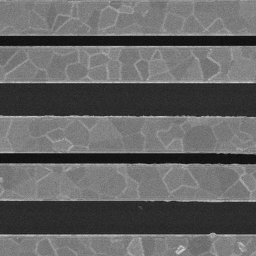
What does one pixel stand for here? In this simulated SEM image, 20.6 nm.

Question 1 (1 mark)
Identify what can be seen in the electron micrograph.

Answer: lines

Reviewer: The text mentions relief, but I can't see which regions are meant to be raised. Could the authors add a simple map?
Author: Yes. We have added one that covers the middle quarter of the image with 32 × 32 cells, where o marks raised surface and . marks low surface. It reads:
oooooooooooooooooooooooooooooooo
oooooooooooooooooooooooooooooooo
oooooooooooooooooooooooooooooooo
oooooooooooooooooooooooooooooooo
oooooooooooooooooooooooooooooooo
................................
................................
................................
................................
................................
................................
................................
................................
oooooooooooooooooooooooooooooooo
oooooooooooooooooooooooooooooooo
oooooooooooooooooooooooooooooooo
oooooooooooooooooooooooooooooooo
oooooooooooooooooooooooooooooooo
oooooooooooooooooooooooooooooooo
oooooooooooooooooooooooooooooooo
oooooooooooooooooooooooooooooooo
oooooooooooooooooooooooooooooooo
................................
................................
................................
oooooooooooooooooooooooooooooooo
oooooooooooooooooooooooooooooooo
oooooooooooooooooooooooooooooooo
oooooooooooooooooooooooooooooooo
oooooooooooooooooooooooooooooooo
oooooooooooooooooooooooooooooooo
oooooooooooooooooooooooooooooooo